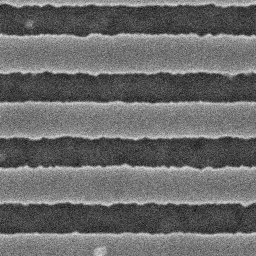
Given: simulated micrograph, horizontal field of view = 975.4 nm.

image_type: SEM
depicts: lines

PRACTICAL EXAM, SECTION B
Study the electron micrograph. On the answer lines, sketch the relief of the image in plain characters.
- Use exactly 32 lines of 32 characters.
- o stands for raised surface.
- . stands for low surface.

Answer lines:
.ooooooooooooooooooooooooo.ooooo
................................
................................
................................
oo.oooooo..oooooooooooooooooooo.
oooooooooooooooooooooooooooooooo
oooooooooooooooooooooooooooooooo
oooooooooooooooooooooooooooooooo
oooooooooooooooooooooooooooooooo
................................
................................
................................
................................
oooooooooooooooooooooooooooooooo
oooooooooooooooooooooooooooooooo
oooooooooooooooooooooooooooooooo
oooooooooooooooooooooooooooooooo
................................
................................
................................
................................
oooooooooooooooooooooooooooooooo
oooooooooooooooooooooooooooooooo
oooooooooooooooooooooooooooooooo
oooooooooooooooooooooooooooooooo
...oo.o...oooo...o..o.oooo....o.
................................
................................
................................
oooooooooooooooooooooooooooooooo
oooooooooooooooooooooooooooooooo
oooooooooooooooooooooooooooooooo